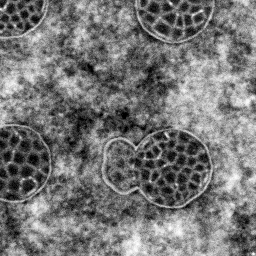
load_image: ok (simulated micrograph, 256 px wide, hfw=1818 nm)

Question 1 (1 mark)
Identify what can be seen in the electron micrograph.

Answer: raised bodies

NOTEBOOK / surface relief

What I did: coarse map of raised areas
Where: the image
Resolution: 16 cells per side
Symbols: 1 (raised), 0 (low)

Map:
1110000001111000
1100000001111000
0000000000110000
0000000000000000
0000000000000000
0000000000000000
0000000000000000
0000000000000000
1100000001110000
1110000111111000
1110001111111000
1110000111111000
1100000001110000
0000000000000000
0000000000000000
0000000000000000